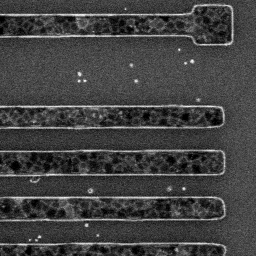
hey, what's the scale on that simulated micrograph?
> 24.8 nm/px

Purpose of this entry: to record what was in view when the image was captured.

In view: wiring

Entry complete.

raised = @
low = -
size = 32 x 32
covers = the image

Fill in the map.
--------------------------------
------------------------@@@@@---
@@@@@@@@@@@@@@@@@@@@@@@@@@@@@---
@@@@@@@@@@@@@@@@@@@@@@@@@@@@@---
@@@@@@@@@--------------@@@@@@---
-------------------------@@@@---
--------------------------------
--------------------------------
--------------------------------
--------------------------------
--------------------------------
--------------------------------
--------------------------------
@@@@@@@@@@@@@@@@@@@@@@@@@@@@----
@@@@@@@@@@@@@@@@@@@@@@@@@@@@----
@@@@@@@@@@@@@@@@@@@@@@@@@@@@----
--------------------------------
--------------------------------
--------------------------------
@@@@@@@@@@@@@@@@@@@@@@@@@@@@----
@@@@@@@@@@@@@@@@@@@@@@@@@@@@----
@@@@@@@@@@@@@@@@@@@@@@@@@@@@----
--------------------------------
--------------------------------
--------------------------------
@@@@@@@@@@@@@@@@@@@@@@@@@@@@----
@@@@@@@@@@@@@@@@@@@@@@@@@@@@----
@@@@@@@@@@@----@@@--------------
--------------------------------
--------------------------------
--------@@@@@@@-@@@@@@@@@@@-----
@@@@@@@@@@@@@@@@@@@@@@@@@@@@----